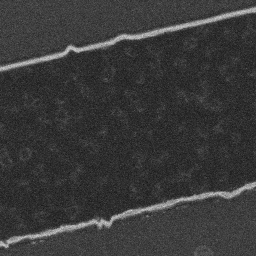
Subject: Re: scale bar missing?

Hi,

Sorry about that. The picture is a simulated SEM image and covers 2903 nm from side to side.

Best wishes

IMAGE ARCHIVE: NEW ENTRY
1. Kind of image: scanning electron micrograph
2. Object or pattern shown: one or a few lines or trenches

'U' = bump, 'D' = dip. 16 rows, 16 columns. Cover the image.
DDDDDDDDDDDDDDDD
DDDDDDDDDDDDUUUU
DDDDDDDUUUUUUUUU
DDDUUUUUUUUUUUUU
UUUUUUUUUUUUUUUU
UUUUUUUUUUUUUUUU
UUUUUUUUUUUUUUUU
UUUUUUUUUUUUUUUU
UUUUUUUUUUUUUUUU
UUUUUUUUUUUUUUUU
UUUUUUUUUUUUUUUU
UUUUUUUUUUUUUUUU
UUUUUUUUUUUUDDDD
UUUUUUUUDDDDDDDD
UUUDDDDDDDDDDDDD
DDDDDDDDDDDDDDDD